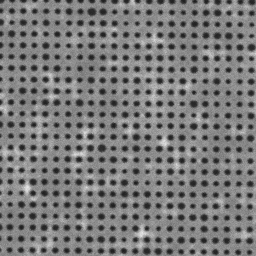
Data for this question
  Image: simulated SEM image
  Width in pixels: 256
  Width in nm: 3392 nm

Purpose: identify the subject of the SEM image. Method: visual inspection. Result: a regular array of holes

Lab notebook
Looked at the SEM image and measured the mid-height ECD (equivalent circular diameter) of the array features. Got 6.18 px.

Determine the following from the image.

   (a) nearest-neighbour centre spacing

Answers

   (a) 145 nm